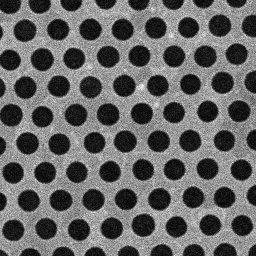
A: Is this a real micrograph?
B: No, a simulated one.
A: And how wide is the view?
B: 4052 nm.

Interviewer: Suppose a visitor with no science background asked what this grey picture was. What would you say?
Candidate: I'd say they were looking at a regular array of holes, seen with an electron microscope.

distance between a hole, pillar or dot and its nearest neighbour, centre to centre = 497 nanometers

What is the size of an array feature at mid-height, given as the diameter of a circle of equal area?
350 nm